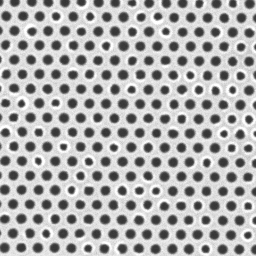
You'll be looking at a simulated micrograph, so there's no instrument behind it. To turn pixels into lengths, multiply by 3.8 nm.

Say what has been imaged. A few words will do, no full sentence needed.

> a regular array of holes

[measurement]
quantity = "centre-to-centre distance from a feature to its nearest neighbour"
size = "62.4 nm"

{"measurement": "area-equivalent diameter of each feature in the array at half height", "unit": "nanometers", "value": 36.6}